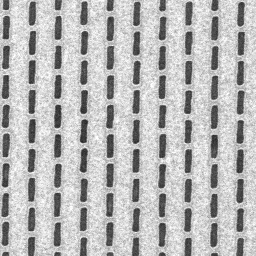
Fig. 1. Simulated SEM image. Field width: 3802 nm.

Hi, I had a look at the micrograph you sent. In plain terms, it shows a regular array of holes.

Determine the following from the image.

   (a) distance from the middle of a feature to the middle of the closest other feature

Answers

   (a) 432 nanometres